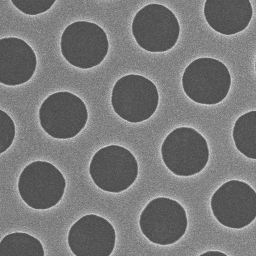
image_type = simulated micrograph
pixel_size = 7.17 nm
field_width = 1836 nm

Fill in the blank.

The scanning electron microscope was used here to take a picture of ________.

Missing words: a regular array of holes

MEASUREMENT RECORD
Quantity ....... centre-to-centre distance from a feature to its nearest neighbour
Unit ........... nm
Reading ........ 524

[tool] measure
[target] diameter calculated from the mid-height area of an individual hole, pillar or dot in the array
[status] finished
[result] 341 nm